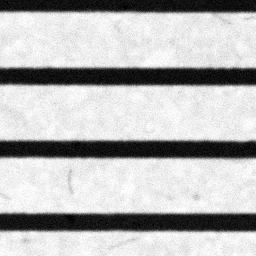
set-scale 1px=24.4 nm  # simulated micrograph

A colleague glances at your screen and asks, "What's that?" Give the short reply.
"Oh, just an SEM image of lines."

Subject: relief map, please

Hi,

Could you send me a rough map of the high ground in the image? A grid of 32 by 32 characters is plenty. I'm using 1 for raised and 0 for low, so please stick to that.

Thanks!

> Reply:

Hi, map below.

00000000000000000000000000000000
00000000000000000000000000000000
11111111111111111111111111111111
11111111111111111111111111111111
11111111111111111111111111111111
11111111111111111111111111111111
11111111111111111111111111111111
11111111111111111111111111111111
00000000000000000000000000000000
00000000000000000000000000000000
00000000000000000000000000000000
11111111111111111111111111111111
11111111111111111111111111111111
11111111111111111111111111111111
11111111111111111111111111111111
11111111111111111111111111111111
11111111111111111111111111111111
00000000000000010000000010011111
00000000000000000000000000000000
00000000000000000000000000000000
11111111111111111111111111111111
11111111111111111111111111111111
11111111111111111111111111111111
11111111111111111111111111111111
11111111111111111111111111111111
11111111111111111111111111111111
11111111111111111111111111111111
00000000000000000000000000000000
00000000000000000000000000000000
11111111111111111111111111111111
11111111111111111111111111111111
11111111111111111111111111111111